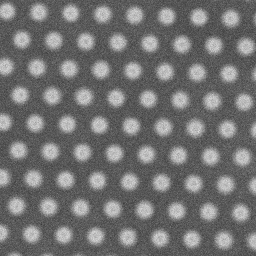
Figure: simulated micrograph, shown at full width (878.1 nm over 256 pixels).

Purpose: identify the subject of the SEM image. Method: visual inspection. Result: an array of small figures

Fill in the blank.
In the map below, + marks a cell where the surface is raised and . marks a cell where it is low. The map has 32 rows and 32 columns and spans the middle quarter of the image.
++++...++++....++++....++++.....
++++...+++++...+++++...+++++...+
+++....++++....++++....+++++...+
++......+++.....+++....++++....+
................................
................................
...++++.....++..................
...++++....++++....++++....++++.
...++++....++++....++++....++++.
...++++....++++....++++....++++.
....++......++.....++++....++++.
................................
................................
++.....+++......++..............
+++....++++....++++....++++....+
+++....++++....++++....++++...++
+++....++++....++++....++++....+
........++.....+++.....++++....+
................................
................................
...+++.....+++......+...........
..+++++...+++++....++++....++++.
..+++++...+++++...+++++...+++++.
...++++....++++...+++++...+++++.
............++.....+++.....+++..
................................
................................
++.....+++.....+++.....++.......
+++...+++++...+++++...++++.....+
+++...+++++...+++++...+++++...++
++....++++....+++++...+++++...++
...............+++.....+++.....+